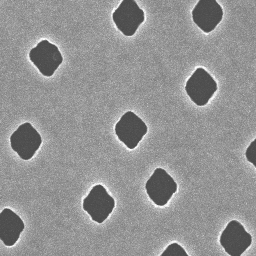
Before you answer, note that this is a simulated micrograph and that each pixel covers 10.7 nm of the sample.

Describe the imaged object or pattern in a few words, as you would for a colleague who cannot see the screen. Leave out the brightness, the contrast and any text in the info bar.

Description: holes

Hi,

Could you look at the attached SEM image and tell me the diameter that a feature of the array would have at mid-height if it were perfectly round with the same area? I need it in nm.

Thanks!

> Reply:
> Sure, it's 342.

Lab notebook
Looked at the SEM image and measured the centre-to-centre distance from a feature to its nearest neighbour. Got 0.785 micrometres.